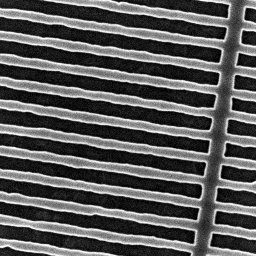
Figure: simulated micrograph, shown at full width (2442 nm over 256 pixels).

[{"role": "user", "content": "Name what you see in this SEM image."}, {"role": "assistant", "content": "parallel lines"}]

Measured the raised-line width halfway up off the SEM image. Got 88.4 nanometres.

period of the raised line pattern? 218 nanometres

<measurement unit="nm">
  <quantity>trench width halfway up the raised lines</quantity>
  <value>129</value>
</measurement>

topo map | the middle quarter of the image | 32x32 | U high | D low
UUUUUDDDDDDDDDDDDDDDDDDDDDDDDDUU
UUUUUUUUUUUDDDDDDDDDDDDDDDDDDDDD
DDDUUUUUUUUUUUUUDUDDDDDDDDDDDDDD
DDDDDDDDDUUUUUUUUUUUUUUUUDDDDDDD
DDDDDDDDDDDDDDDDUUUUUUUUUUUUUUUD
DDDDDDDDDDDDDDDDDDDDDDDUUUUUUUUU
UUUUUDDDDDDDDDDDDDDDDDDDDDDDDDDU
UUUUUUUUUUUUUDDDDDDDDDDDDDDDDDDD
DDDDDUUUUUUUUUUUUUUDDDDDDDDDDDDD
DDDDDDDDDDDDUUUUUUUUUUUUUUDDDDDD
DDDDDDDDDDDDDDDDDDDUUUUUUUUUUUUD
UDDDDDDDDDDDDDDDDDDDDDDDUUUUUUUU
UUUUUUUUDDDDDDDDDDDDDDDDDDDDDDDU
UUUUUUUUUUUUUUDDDDDDDDDDDDDDDDDD
DDDDDUUUUUUUUUUUUUUUUDDDDDDDDDDD
DDDDDDDDDDDDDUUUUUUUUUUUUUDDDDDD
DDDDDDDDDDDDDDDDDDDDUUUUUUUUUUUU
UUUDDDDDDDDDDDDDDDDDDDDDDUUUUUUU
UUUUUUUUUDDDDDDDDDDDDDDDDDDDDDDD
UUUUUUUUUUUUUUDDDDDDDDDDDDDDDDDD
DDDDDDDUUUUUUUUUUUUUUUDDDDDDDDDD
DDDDDDDDDDDDDUUUUUUUUUUUUUUUUDDD
DDDDDDDDDDDDDDDDDDDDDUUUUUUUUUUU
UUUUDDDDDDDDDDDDDDDDDDDDDDDDUUUU
UUUUUUUUUDDDDDDDDDDDDDDDDDDDDDDD
DUUUUUUUUUUUUUUUUUUDDDDDDDDDDDDD
DDDDDDDDDUUUUUUUUUUUUUUUDDDDDDDD
DDDDDDDDDDDDDDDDUUUUUUUUUUUUUUUD
DDDDDDDDDDDDDDDDDDDDDUUUUUUUUUUU
UUUUUUDDDDDDDDDDDDDDDDDDDDDDUUUU
UUUUUUUUUUUUDDDDDDDDDDDDDDDDDDDD
DDDDDUUUUUUUUUUUUUUDDDDDDDDDDDDD